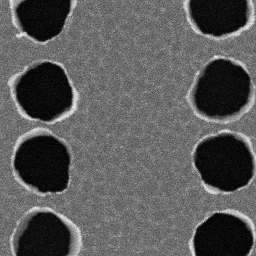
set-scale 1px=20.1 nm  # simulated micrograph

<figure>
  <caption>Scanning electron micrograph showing holes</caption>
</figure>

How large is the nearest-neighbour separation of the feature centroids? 1450 nm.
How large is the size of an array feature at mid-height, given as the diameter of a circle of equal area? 1180 nm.